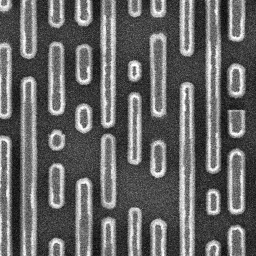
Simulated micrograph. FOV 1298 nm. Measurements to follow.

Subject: parallel lines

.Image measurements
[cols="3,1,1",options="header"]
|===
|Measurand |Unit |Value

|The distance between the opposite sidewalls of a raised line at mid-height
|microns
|0.0633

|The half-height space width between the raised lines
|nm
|72.8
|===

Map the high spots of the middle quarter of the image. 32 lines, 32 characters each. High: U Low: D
DDDUUUUDDDUUDDDDDUUDDDUUUDDDDDDD
DDDUUUUDDDUUDDDDDUUDDDUUUDDDDDDD
DDDUUUUDDDUUDDDDDUUDDDUUUDDDDDDD
DDDUUUUDDDUUDDDDDUUDDDUUUDDDDDDD
DDDDUUDDDDUUDDDDDDDDDDUUUDDDDDDD
DDDDDDDDDDUUDDDDDDDDDDUUUDDDDDUU
DDDDDDDDDDUUDDDDDDDDDDUUUDDDDDUU
DDDDDDDDDDUUDDDDDDDDDDUUUDDDDDUU
DDDDDDDDDDUUDDDDDUUDDDUUUDDDDDUU
DDDDDDDDDDUUDDDDDUUDDDUUUDDDDDUU
DDDDDDDDDDUUDDDDDUUDDDUUUDDDDDUU
DDDUUUUDDDUUDDDDDUUDDDUUUDDDDDUU
DDDUUUUDDDUUDDDDDUUDDDDUUDDDDDUU
DDDUUUDDDDUUDDDDDUUDDDDDDDDDDDUU
DDDUUUDDDDUUDDDDDUUDDDDDDDDDDDUU
DDDUUUDDDDDDDDDDDUUDDDDDDDDDDDUU
DDDDUUDDDDDDDDDDDUUDDDDDDDDDDDUU
DDDDDDDDDDDDDDDDDUUDDDDDDDDDDDUU
DDDDDDDDDDUUDDDDDUUDDDDDDDDDDDUU
DDDDDDDDDDUUDDDDDUUDDDDDDDDDDDUU
DDDDDDDDDDUUDDDDDUUDDDUUUDDDDDUU
DDDDDDDDDDUUDDDDDUUDDDUUUDDDDUUU
DDDDDDDDDDUUDDDDUUUDDDUUUDDDDUUU
DDDDDDDDDDUUDDDDUUUDDDUUUDDDDUUU
DDDDDDDDDDUUDDDDDUDDDDUUUDDDDUUU
DDDDDDDDDDUUUDDDDDDDDDUUUDDDDUUU
DDDDDDDDDDUUUDDDDDDDDDUUUDDDDUUU
DDDDDDDDDDUUUDDDDDDDDDUUUDDDDUUU
DDDDDDDDDDUUUDDDDDDDDDDDDDDDDUUU
DDDDUUDDDDUUUDDDDDDDDDDDDDDDDUUU
DDDUUUUDDDUUUDDDDDDDDDDDDDDDDUUU
DDDUUUUDDDUUUDDDDDDDDDDDDDDDDUUU